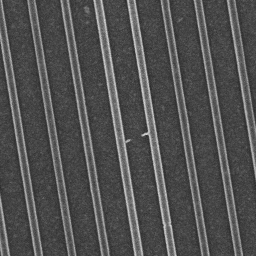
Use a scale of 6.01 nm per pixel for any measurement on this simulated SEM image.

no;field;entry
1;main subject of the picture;parallel lines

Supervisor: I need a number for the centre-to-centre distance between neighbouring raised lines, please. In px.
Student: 32.9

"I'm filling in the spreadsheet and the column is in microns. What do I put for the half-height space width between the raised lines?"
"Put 0.156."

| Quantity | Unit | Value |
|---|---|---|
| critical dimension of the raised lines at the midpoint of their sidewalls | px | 7.65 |